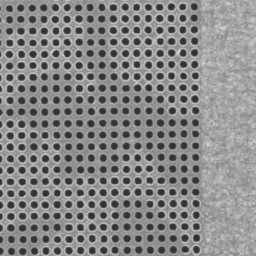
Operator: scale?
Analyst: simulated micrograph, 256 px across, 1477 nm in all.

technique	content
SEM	a regular array of holes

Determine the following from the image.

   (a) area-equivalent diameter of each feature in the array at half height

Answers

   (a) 43.2 nanometres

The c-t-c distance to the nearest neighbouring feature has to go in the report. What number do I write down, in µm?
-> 0.0639